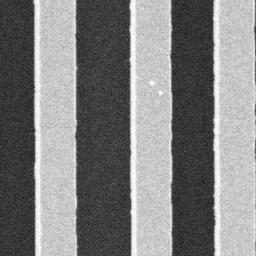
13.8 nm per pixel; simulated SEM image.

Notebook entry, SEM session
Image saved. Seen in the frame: lines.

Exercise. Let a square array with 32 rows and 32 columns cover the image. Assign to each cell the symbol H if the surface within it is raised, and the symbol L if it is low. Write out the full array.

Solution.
LLLLHHHHHLLLLLLLHHHHHLLLLLLHHHHH
LLLLHHHHHLLLLLLLHHHHHLLLLLLHHHHH
LLLLHHHHHLLLLLLLHHHHHLLLLLLHHHHH
LLLLHHHHHLLLLLLLHHHHHLLLLLLHHHHH
LLLLHHHHHLLLLLLLHHHHHLLLLLLHHHHH
LLLLHHHHHLLLLLLLHHHHHLLLLLLHHHHH
LLLLHHHHHLLLLLLLHHHHHLLLLLLHHHHH
LLLLHHHHHLLLLLLLHHHHHLLLLLLHHHHH
LLLLHHHHHLLLLLLLHHHHHLLLLLLHHHHH
LLLLHHHHHLLLLLLLHHHHHLLLLLLHHHHH
LLLLHHHHHLLLLLLLHHHHHLLLLLLHHHHH
LLLLHHHHHLLLLLLLHHHHHLLLLLLHHHHH
LLLLHHHHHLLLLLLLHHHHHLLLLLLHHHHH
LLLLHHHHHLLLLLLLHHHHHLLLLLLHHHHH
LLLLHHHHHLLLLLLLHHHHHLLLLLLHHHHH
LLLLHHHHHLLLLLLLHHHHHLLLLLLHHHHH
LLLLLHHHHLLLLLLLHHHHHLLLLLLHHHHH
LLLLLHHHHLLLLLLLHHHHHLLLLLLHHHHH
LLLLLHHHHLLLLLLLHHHHHLLLLLLHHHHH
LLLLLHHHHLLLLLLLHHHHHLLLLLLHHHHH
LLLLLHHHHLLLLLLLHHHHHLLLLLLHHHHH
LLLLHHHHHLLLLLLLHHHHHLLLLLLHHHHH
LLLLLHHHHLLLLLLLHHHHHLLLLLLHHHHH
LLLLLHHHHLLLLLLLLHHHHLLLLLLHHHHH
LLLLLHHHHLLLLLLLLHHHHLLLLLLHHHHH
LLLLLHHHHLLLLLLLLHHHHLLLLLLHHHHH
LLLLLHHHHLLLLLLLLHHHHLLLLLLHHHHH
LLLLLHHHHLLLLLLLLHHHHLLLLLLHHHHH
LLLLLHHHHLLLLLLLLHHHHLLLLLLHHHHH
LLLLLHHHHLLLLLLLLHHHHLLLLLLHHHHH
LLLLLHHHHLLLLLLLLHHHHLLLLLLHHHHH
LLLLLHHHHLLLLLLLLHHHHLLLLLLHHHHH